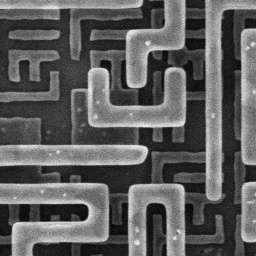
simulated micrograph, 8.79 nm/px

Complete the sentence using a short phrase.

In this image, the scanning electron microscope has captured wiring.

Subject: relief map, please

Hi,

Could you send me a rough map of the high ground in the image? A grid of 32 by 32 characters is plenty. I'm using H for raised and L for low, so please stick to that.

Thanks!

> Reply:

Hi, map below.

HHHHHHHHHHHHHHHHHHLLLHHLLLHHHHHH
LLLLLLLLLLLLLLLLLLLLLHHLLLHHLLLL
LLLLLLLLLLLLLLLLLLLLLHHLLLHHLLLL
LLLLLLLLLLLLLLLLLLLLHHHLLLHHLLLL
LLLLLLLLLLLLLLLLHHHHHHHLLLHHLLHH
LLLLLLLLLLLLLLLLHHHHHHHLLLHHLLHH
LLLLLLLLLLLLLLLLHHHLLLLLLLHHLLHH
LLLLLLLLLLLLLLLLHHLLLLLLLLHHLLHH
LLLLLLLLLLLLLLLLHHLLLHLLLLHHLLHH
LLLLLLLLLLLHHHLLHHLLLHHLLLHHLLHH
LLLLLLLLLLLHHHLLHHLLLHHLLLHHLLHH
LLLLLLLLLLLHHHLLLLLLLHHLLLHHLLHH
LLLLLLLLLLLHHHLLLLLLHHHLLLHHLLHH
LLLLLLLLLLLHHHHHHHHHHHHLLLHHLLHH
LLLLLLLLLLLHHHHHHHHHHHHLLLHHLLHH
LLLLLLLLLLLHHHHHHHHHHHHLLLHHLLHH
LLLLLLLLLLLLLLLLLLLLLLLLLLHHLLHH
LLLLLLLLLLLLLLLLLLLLLLLLLLHHLLHH
HHHHHHHHHHHHHHHHHHLLLLLLLLHHLLHH
HHHHHHHHHHHHHHHHHHLLLLLLLLHHLLHH
HHHHHHHHHHHHHHHHHLLLLLLLLLHHLLLH
LLLLLLLLLLLLLLLLLLLLLLLLLLHHLLLL
LLLLLLLLLLLLLLLLLLLLLLLLLLHHLLLL
HHHHHHHHHHHHHLLLHHHHHHHLLLHHLLHH
HHHHHHHHHHHHHHLLHHHHHHHLLLHHLLHH
LLLLLLLLLLHHHHLLHHHLHHHLLLLLLLHH
LLLLLLLLLLLHHHLLHHLLLHHLLLLLLLHH
LLLLLLLLLLLHHHLLHHLLLHHLLLLLLLHH
LLHHHHHHHHHHHHLLHHLLLHHLLLLLLLHH
LLHHHHHHHHHHHLLLHHLLLHHLLLLLLLHH
LLHHLLLLLLLLLLLLHHLLLHHLLLLLLLLL
LLHHLLLLLLLLLLLLHHLLLHHLLLLLLLLL